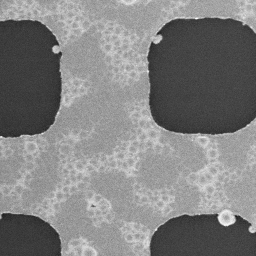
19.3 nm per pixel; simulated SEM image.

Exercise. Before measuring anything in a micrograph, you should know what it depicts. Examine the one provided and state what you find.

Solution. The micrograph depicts holes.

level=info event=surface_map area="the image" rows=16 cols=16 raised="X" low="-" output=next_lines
XXXXXXXXXXXXXXXX
---XXXXXXX-----X
----XXXXXX------
----XXXXX-------
----XXXXX-------
----XXXXX-------
----XXXXX-------
---XXXXXXX------
-XXXXXXXXXXXXXXX
XXXXXXXXXXXXXXXX
XXXXXXXXXXXXXXXX
XXXXXXXXXXXXXXXX
XXXXXXXXXXXXXXXX
--XXXXXXXXX--XXX
----XXXXXX------
----XXXXX-------